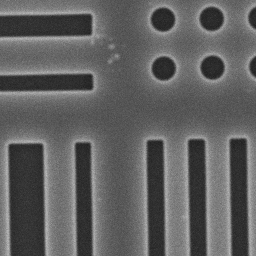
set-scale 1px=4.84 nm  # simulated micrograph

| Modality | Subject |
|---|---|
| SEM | groups of lines, slits or small figures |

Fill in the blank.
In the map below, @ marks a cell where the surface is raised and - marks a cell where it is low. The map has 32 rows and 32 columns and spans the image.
@@@@@@@@@@@@@@@@@@@@@@@@@@@@@@@@
@@@@@@@@@@@@@@@@@@@---@@@---@@@-
------------@@@@@@@---@@@---@@@-
------------@@@@@@@---@@@--@@@@@
-----------@@@@@@@@@@@@@@@@@@@@@
@@@@@@@@@@@@@@@@@@@@@@@@@@@@@@@@
@@@@@@@@@@@@@@@@@@@@@@@@@@@@@@@@
@@@@@@@@@@@@@@@@@@@---@@@---@@@-
@@@@@@@@@@@@@@@@@@@---@@@---@@@-
------------@@@@@@@---@@@---@@@@
------------@@@@@@@@@@@@@@@@@@@@
-@@@@@@@@@@@@@@@@@@@@@@@@@@@@@@@
@@@@@@@@@@@@@@@@@@@@@@@@@@@@@@@@
@@@@@@@@@@@@@@@@@@@@@@@@@@@@@@@@
@@@@@@@@@@@@@@@@@@@@@@@@@@@@@@@@
@@@@@@@@@@@@@@@@@@@@@@@@@@@@@@@@
@@@@@@@@@@@@@@@@@@@@@@@@@@@@@@@@
@@@@@@@@@@@@@@@@@@@-@@@@-@@@@--@
@-----@@@--@@@@@@@---@@---@@@--@
@-----@@@--@@@@@@@---@@---@@@--@
@-----@@@--@@@@@@@---@@---@@@--@
@-----@@@--@@@@@@@---@@---@@@--@
@-----@@@--@@@@@@@---@@@--@@@--@
@-----@@@---@@@@@@---@@@--@@@--@
@-----@@@---@@@@@@---@@@--@@@--@
@-----@@@---@@@@@@---@@@--@@@--@
@-----@@@---@@@@@@---@@@--@@@--@
@-----@@@---@@@@@@---@@@--@@@--@
@-----@@@---@@@@@@---@@@--@@@--@
@-----@@@---@@@@@@---@@@--@@@--@
@-----@@@---@@@@@@---@@@--@@@--@
@-----@@@@--@@@@@@---@@@--@@@--@